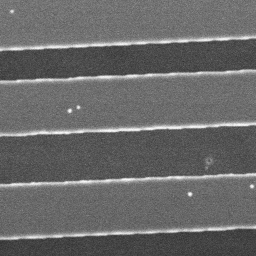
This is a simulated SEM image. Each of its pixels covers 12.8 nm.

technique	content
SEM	lines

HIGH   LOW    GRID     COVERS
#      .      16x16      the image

################
################
#############...
................
..............##
################
################
################
................
................
................
.###############
################
################
##########......
................